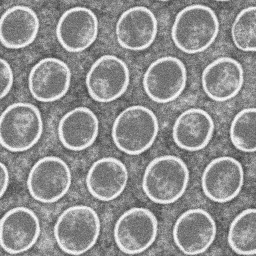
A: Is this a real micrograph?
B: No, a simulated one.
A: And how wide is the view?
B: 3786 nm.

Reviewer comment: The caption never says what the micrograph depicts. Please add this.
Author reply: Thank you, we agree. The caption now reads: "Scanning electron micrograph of a regular array of raised bodies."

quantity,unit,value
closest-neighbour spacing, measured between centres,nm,846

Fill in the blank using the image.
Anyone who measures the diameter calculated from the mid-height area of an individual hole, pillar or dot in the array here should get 0.606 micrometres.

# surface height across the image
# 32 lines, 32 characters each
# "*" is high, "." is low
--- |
................................
.***....***.....***....***....**
*****...****...****...*****...**
*****..*****...****...*****..***
****...*****...****...*****..***
.**.....***....****...****....**
................................
.............**.....**......*...
*...****....****...****...****..
*...****...*****..*****..*****..
*...****...*****..*****..*****..
*...****...****....***....***...
.............*......*...........
.***.............*..............
*****...****...****....***....**
*****...****..*****...****...***
*****...****..*****...****...***
****....****..*****...****...***
.**......*.....***.....**.....**
................................
.....***....***....****...****..
*...*****..*****..*****...****..
*...*****..*****..*****..*****..
*...****...****...*****...****..
....****....**.....***....***...
................................
.***....****....**......*......*
*****...****...****...****....**
*****..*****...****...*****..***
*****..*****...****...*****..***
****...*****...****...****...***
.........*.............**.....**